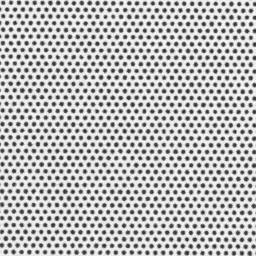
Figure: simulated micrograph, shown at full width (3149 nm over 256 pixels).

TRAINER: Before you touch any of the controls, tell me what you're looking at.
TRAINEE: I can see a regular array of holes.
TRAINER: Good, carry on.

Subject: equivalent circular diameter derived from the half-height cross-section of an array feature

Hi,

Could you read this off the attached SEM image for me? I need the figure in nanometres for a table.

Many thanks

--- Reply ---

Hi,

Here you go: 60.5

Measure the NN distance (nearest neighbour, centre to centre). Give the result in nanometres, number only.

92.4